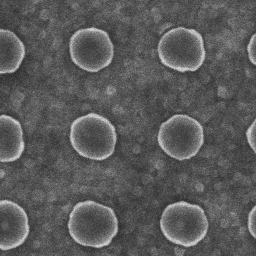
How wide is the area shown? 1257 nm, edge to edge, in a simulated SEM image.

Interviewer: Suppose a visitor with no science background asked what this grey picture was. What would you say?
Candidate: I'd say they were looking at raised bodies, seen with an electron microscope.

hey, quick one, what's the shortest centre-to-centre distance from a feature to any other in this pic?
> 428 nanometers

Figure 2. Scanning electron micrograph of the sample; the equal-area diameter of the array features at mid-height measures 0.217 µm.